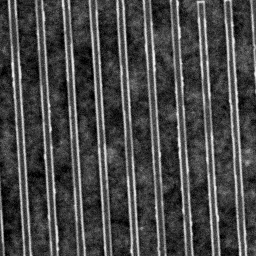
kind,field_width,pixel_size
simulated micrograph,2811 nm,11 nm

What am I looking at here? parallel lines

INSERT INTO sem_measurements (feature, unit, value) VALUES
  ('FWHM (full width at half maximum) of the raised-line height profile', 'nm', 76.7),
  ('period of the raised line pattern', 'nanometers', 295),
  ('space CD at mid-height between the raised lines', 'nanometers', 221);